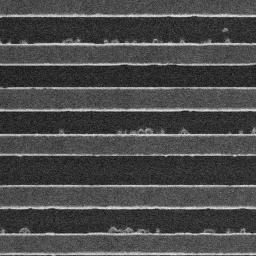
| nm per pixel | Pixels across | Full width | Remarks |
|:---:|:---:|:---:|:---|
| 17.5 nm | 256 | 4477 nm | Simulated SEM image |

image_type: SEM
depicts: lines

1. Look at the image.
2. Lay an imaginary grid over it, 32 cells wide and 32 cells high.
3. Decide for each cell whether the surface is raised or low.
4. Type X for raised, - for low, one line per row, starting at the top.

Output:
XXXXXXXXXXXXXXXXXXXXXXXXXXXXXXXX
XXXXXXXXXXXXXXXXXXXXXXXXXXXXXXXX
--------------------------------
--------------------------------
--------------------------------
----------------------------XX--
XXXXXXXXXXXXXXXXXXXXXXXXXXXXXXXX
XXXXXXXXXXXXXXXXXXXXXXXXXXXXXXXX
--------------------------------
--------------------------------
--------------------------------
XXXXXXXXXXXXXXXXXXXXXXXXXXXXXXXX
XXXXXXXXXXXXXXXXXXXXXXXXXXXXXXXX
XXXXXXXXXXXXXXXXXXXXXXXXXXXXXXXX
--------------------------------
--------------------------------
--------------------------------
XXXXXXXXXXXXXXXXXXXXXXXXXXXXXXXX
XXXXXXXXXXXXXXXXXXXXXXXXXXXXXXXX
--------------------------------
--------------------------------
--------------------------------
--------------------------------
XXXXXXXXXXXXXXXXXXXXXXXXXXXXXXXX
XXXXXXXXXXXXXXXXXXXXXXXXXXXXXXXX
XXXXXXXXXXXXXXXXXXXXXXXXXXXXXXXX
--------------------------------
--------------------------------
--------------------------------
XXXXXXXXXXXXXXXXXXXXXXXXXXXXXXXX
XXXXXXXXXXXXXXXXXXXXXXXXXXXXXXXX
XXXXXXXXXXXXXXXXXXXXXXXXXXXXXXXX